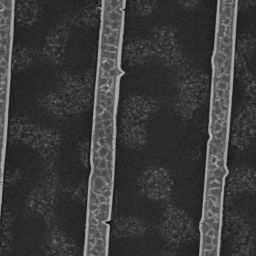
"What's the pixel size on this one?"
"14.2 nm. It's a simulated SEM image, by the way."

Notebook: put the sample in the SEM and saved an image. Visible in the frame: one or a few lines or trenches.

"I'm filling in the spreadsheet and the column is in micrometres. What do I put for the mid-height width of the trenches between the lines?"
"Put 1.31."